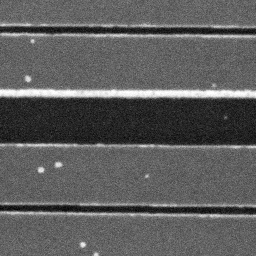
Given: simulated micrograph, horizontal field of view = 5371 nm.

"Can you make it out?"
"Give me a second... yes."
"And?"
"lines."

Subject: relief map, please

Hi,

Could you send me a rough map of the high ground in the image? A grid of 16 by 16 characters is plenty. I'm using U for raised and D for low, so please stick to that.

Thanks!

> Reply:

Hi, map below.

UUUUUUUUUUUUUUUU
UUUUUUUUUUUUUUUU
UUUUUUUUUUUUUUUU
UUUUUUUUUUUUUUUU
UUUUUUUUUUUUUUUU
UUUUUUUUUUUUUUUU
DDDDDDDDDDDDDDDD
DDDDDDDDDDDDDDDD
DDDDDDDDDDDDDDDD
UUUUUUUUUUUUUUUU
UUUUUUUUUUUUUUUU
UUUUUUUUUUUUUUUU
UUUUUUUUUUUUUUUU
UUUUUUUUUUUUUUUU
UUUUUUUUUUUUUUUU
UUUUUUUUUUUUUUUU